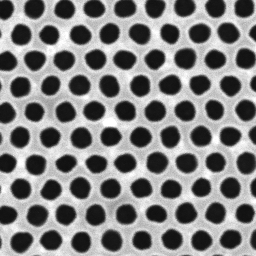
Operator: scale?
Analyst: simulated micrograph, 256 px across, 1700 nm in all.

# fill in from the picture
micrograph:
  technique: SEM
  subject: a regular array of holes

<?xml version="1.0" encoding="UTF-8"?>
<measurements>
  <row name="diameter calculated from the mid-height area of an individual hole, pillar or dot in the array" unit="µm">0.139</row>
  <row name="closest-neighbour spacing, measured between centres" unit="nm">192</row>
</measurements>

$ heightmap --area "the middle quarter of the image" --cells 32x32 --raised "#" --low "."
..####....###....####...####....
.######.##############.#######.#
################################
##....###....####....####....###
#......##.....###....###.....##.
#......##.....##......##.....##.
#......##.....###.....##.....###
##....####...####....####...####
###########.####################
.#####..######...#####..#####...
..###.....###.....###....###....
...##.....###.....##......##....
...##.....###.....##......##....
...##....#####....###....###....
.###############################
###########################.####
###...####....###....####....###
##.....##.....###.....##.....###
##.....##......#......##.....###
##.....##.....###.....##.....###
###...#####.######...####...####
################################
##############..#####....####...
...###....###....####.....##....
...##......#......###.....##....
...##......##.....##......##....
..####....###....####....####...
################################
###..###########################
##....####....###....####...####
#......##.....###.....##.....###
#......##.....###.....##......##